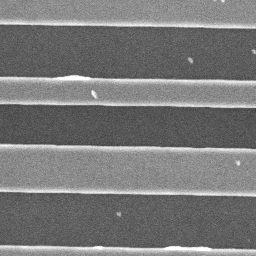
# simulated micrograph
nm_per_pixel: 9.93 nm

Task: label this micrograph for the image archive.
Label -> lines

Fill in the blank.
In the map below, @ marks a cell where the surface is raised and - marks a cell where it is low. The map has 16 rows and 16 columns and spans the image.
@@@@@@@@@@@@@@@@
----@@@@@@@@@@@@
----------------
----------------
----------------
@@@@@@@@@@@@@@@@
---@@@@@@@@@@@@@
----------------
----------------
@@@@@@@@@@@@@@@@
@@@@@@@@@@@@@@@@
@@@@@@@@@@@@@@@@
----------------
----------------
----------------
@@@@@@@---@@@---